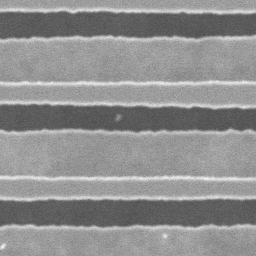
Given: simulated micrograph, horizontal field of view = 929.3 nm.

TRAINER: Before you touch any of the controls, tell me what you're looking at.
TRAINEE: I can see lines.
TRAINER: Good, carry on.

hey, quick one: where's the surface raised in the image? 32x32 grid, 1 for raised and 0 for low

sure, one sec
11111111111111111111111111111111
00000000000000000000010111111111
00000000000000000000000000000000
00000000000000000000000000000000
00000000000000000000000000000000
11111111111111111111111111111111
11111111111111111111111111111111
11111111111111111111111111111111
11111111111111111111111111111111
11111111111111111111111111111111
11111111111111111111111111111111
11111111111111111111111111111111
11111111111111111111111111111111
00000000000000000000000000000000
00000000000000000000000000000000
00000000000000000000000000000000
11011111111111110011111111111111
11111111111111111111111111111111
11111111111111111111111111111111
11111111111111111111111111111111
11111111111111111111111111111111
11111111111111111111111111111111
11111111111111111111111111111111
11111111111111111111111111111111
11111111111111111111111111111111
00000000000000000000000000000000
00000000000000000000000000000000
00000000000000000000000000000000
11111111111100111111111101111111
11111111111111111111111111111111
11111111111111111111111111111111
11111111111111111111111111111111